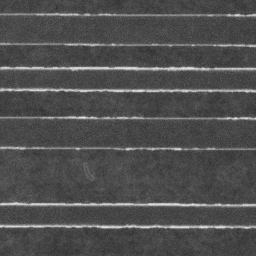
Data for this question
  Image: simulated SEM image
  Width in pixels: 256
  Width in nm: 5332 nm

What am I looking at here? lines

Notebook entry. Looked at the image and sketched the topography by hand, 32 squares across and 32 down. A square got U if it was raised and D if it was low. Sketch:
DDDDDDDDDDDDDDDDDDDDDDDDDDDDDDDD
DDDDDDDDDDDDDDDDDDDDDDDDDDDDDDDD
UUUUUUUUUUUUUUUUUUUUUUUUUUUUUUUU
UUUUUUUUUUUUUUUUUUUUUUUUUUUUUUUU
UUUUUUUUUUUUUUUUUUUUUUUUUUUUUUUU
DDDDDDDDUUUUUUUUUUUUUUUUUUUUUUUU
DDDDDDDDDDDDDDDDDDDDDDDDDDDDDDDD
DDDDDDDDDDDDDDDDDDDDDDDDDDDDDDDD
DDDDDDDDDDDDDDDDDDDDDDDDDDDDDDDD
UUUUUUUUUUUUUUUUUUUUUUUUUUUUUUUU
UUUUUUUUUUUUUUUUUUUUUUUUUUUUUUUU
DDDDDDDDDDDDDDDDDDDDDDDDDDDDDDDD
DDDDDDDDDDDDDDDDDDDDDDDDDDDDDDDD
DDDDDDDDDDDDDDDDDDDDDDDDDDDDDDDD
DDDDDDDDDDDDDDDDDDDDDDDDDDDDDDDD
UUUUUUUUUUUUUUUUUUUUUUUUUUUUUUUU
UUUUUUUUUUUUUUUUUUUUUUUUUUUUUUUU
UUUUUUUUUUUUUUUUUUUUUUUUUUUUUUUU
UUUUUUUUUUUUUUUUUUUUUUUUUUUUUUUU
DDDDDDDDDDDDDDDDDDDDDDDDDDDDDDDD
DDDDDDDDDDDDDDDDDDDDDDDDDDDDDDDD
DDDDDDDDDDDDDDDDDDDDDDDDDDDDDDDD
DDDDDDDDDDDDDDDDDDDDDDDDDDDDDDDD
DDDDDDDDDDDDDDDDDDDDDDDDDDDDDDDD
DDDDDDDDDDDDDDDDDDDDDDDDDDDDDDDD
DDDDDDDDDDDDDDDDDDDDDDDDDDDDDDDD
UUUUUUUUUUUUUUUUUUUUUUUUUUUUUUUU
UUUUUUUUUUUUUUUUUUUUUUUUUUUUUUUU
DDDDDDDDDDDDDDDDDDDDDDDDDDDDDDDD
DDDDDDDDDDDDDDDDDDDDDDDDDDDDDDDD
DDDDDDDDDDDDDDDDDDDDDDDDDDDDDDDD
DDDDDDDDDDDDDDDDDDDDDDDDDDDDDDDD